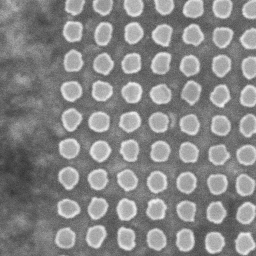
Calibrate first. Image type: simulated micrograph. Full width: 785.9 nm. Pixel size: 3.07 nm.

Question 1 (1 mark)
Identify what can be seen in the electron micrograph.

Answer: a regular array of raised bodies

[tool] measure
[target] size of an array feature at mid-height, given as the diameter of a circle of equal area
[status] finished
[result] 19.5 pixels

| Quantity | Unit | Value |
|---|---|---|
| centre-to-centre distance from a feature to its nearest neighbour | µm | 0.0874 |